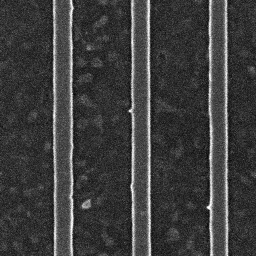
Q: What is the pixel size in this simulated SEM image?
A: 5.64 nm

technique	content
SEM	one or a few lines or trenches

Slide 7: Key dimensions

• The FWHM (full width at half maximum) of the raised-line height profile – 98.1 nanometres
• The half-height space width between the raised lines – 339 nanometres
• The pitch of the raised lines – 439 nm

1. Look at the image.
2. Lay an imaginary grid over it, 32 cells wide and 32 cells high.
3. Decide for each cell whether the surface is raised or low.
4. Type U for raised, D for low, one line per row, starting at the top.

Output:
DDDDDDDUUDDDDDDDDUUDDDDDDDUUDDDD
DDDDDDDUUDDDDDDDDUUDDDDDDDUUDDDD
DDDDDDDUUDDDDDDDDUUDDDDDDDUUDDDD
DDDDDDDUUDDDDDDDDUUDDDDDDDUUDDDD
DDDDDDDUUDDDDDDDDUUDDDDDDDUUDDDD
DDDDDDDUUDDDDDDDDUUDDDDDDDUUDDDD
DDDDDDDUUDDDDDDDDUUDDDDDDDUUDDDD
DDDDDDDUUDDDDDDDDUUDDDDDDDUUDDDD
DDDDDDDUUDDDDDDDDUUDDDDDDDUUDDDD
DDDDDDDUUDDDDDDDDUUDDDDDDDUUDDDD
DDDDDDDUUDDDDDDDDUUDDDDDDDUUDDDD
DDDDDDDUUDDDDDDDDUUDDDDDDDUUDDDD
DDDDDDDUUDDDDDDDDUUDDDDDDDUUDDDD
DDDDDDDUUDDDDDDDUUUDDDDDDDUUDDDD
DDDDDDDUUDDDDDDDUUUDDDDDDDUUDDDD
DDDDDDDUUDDDDDDDDUUDDDDDDDUUDDDD
DDDDDDDUUDDDDDDDDUUDDDDDDDUUDDDD
DDDDDDDUUDDDDDDDDUUDDDDDDDUUDDDD
DDDDDDDUUDDDDDDDDUUDDDDDDDUUDDDD
DDDDDDDUUDDDDDDDDUUDDDDDDDUUDDDD
DDDDDDDUUDDDDDDDDUUDDDDDDDUUDDDD
DDDDDDDUUDDDDDDDDUUDDDDDDDUUDDDD
DDDDDDDUUDDDDDDDUUUDDDDDDDUUDDDD
DDDDDDDUUDDDDDDDUUUDDDDDDDUUDDDD
DDDDDDDUUDDDDDDDDUUDDDDDDDUUDDDD
DDDDDDDUUDDDDDDDDUUDDDDDDDUUDDDD
DDDDDDDUUDDDDDDDDUUDDDDDDDUUDDDD
DDDDDDDUUDDDDDDDDUUDDDDDDDUUDDDD
DDDDDDDUUDDDDDDDDUUDDDDDDDUUDDDD
DDDDDDDUUDDDDDDDDUUDDDDDDDUUDDDD
DDDDDDDUUDDDDDDDDUUDDDDDDDUUDDDD
DDDDDDDUUDDDDDDDDUUDDDDDDDUUDDDD